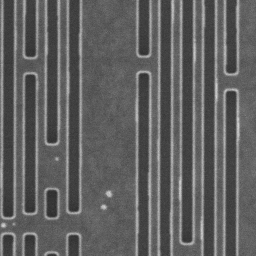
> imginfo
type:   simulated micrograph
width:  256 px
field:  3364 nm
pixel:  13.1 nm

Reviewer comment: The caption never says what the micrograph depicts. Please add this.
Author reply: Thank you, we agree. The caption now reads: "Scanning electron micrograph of groups of lines, slits or small figures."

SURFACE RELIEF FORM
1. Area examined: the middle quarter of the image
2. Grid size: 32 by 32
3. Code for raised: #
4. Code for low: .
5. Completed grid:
#...####################...##...
#...####################...##...
#...###############..###...##...
#...##############....##...##...
#...##############....##...##...
#...##############....##...##...
#...##############....##...##...
#...##############....##...##...
#...##############....##...##...
#...##############....##...##...
#...##############....##...##...
#...##############....##...##...
#...##############....##...##...
#...##############....##...##...
#...##############....##...##...
#...##############....##...##...
#...##############....##...##...
#...##############....##...##...
#...##############....##...##...
#...##############....##...##...
#...##############....##...##...
#...##############....##...##...
#...##############....##...##...
#...##############....##...##...
#...##############....##...##...
#...##############....##...##...
#...##############....##...##...
#...##############....##...##...
#...##############....##...##...
#...##############....##...##...
#...##############....##...##...
#...##############....##...##...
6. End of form